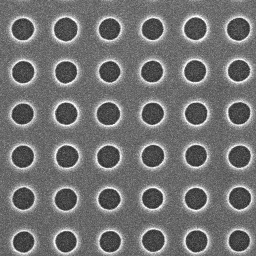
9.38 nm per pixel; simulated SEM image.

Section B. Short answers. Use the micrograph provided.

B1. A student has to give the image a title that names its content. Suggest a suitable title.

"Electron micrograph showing a regular array of holes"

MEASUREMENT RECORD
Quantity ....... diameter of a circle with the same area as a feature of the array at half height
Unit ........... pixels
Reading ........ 22.8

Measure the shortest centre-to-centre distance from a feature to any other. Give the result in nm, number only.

396